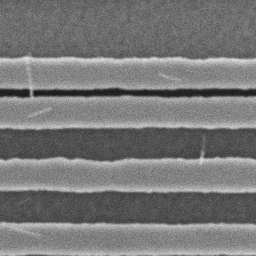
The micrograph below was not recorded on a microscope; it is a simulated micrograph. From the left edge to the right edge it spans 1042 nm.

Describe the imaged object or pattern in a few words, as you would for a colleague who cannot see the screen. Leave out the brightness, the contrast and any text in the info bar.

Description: lines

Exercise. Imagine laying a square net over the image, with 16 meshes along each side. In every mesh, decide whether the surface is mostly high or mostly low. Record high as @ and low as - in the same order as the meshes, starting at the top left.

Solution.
----------------
----------------
----------------
----------------
@@@@@@@@@@@@@@@@
@@@@@@@@@@@@@@@@
@@@@@@@@@@@@@@@@
@@@@@@@@@@@@@@@@
----------------
----------------
@@@@@@@@@@@@@@@@
@@@@@@@@@@@@@@@@
----------------
----------------
@@@@@@@@@@@@@@@@
@@@@@@@@@@@@@@@@